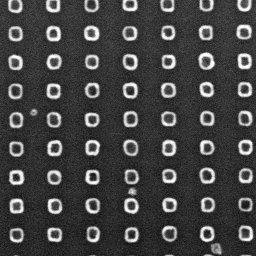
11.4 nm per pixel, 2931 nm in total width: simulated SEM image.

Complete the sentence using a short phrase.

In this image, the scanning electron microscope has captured a regular array of raised bodies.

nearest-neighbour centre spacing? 326 nanometres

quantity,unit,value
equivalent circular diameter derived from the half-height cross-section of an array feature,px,13.8